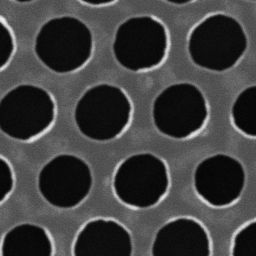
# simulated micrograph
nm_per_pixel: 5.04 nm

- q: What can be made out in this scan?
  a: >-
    a regular array of holes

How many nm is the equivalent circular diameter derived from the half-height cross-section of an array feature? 272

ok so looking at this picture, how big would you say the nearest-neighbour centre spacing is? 386 nanometers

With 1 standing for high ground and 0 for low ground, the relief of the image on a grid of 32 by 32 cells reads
11111111111001111111111111111111
11111111111111111111111111111111
11111100001111110001111111000111
01111000000111100000111100000011
01111000000111000000011100000001
00110000000111000000011100000001
00110000000111000000011100000011
01111000000111100000111100000011
11111100001111110011111111000111
11111111111111111111111111111111
11111111111111111111110011111111
10000011111000011111000001111100
00000011110000001110000001111000
00000001100000001110000000111000
00000001100000001110000000111000
00000011110000001110000001111000
00000111110000011111000011111100
11111111111101111111111111111111
11111111111111111111111111111111
11111110011111111001111111100111
01111100000111100000111110000011
01111000000111100000011100000011
00111000000111000000011100000001
01111000000111000000011100000011
01111000000111100000111110000011
11111100001111110001111111001111
11111111111111111111111111111111
11111111111101111111110011111111
11000111110000011111000001111110
10000011110000001110000000111100
00000011100000001110000000111000
00000011100000001110000000111000